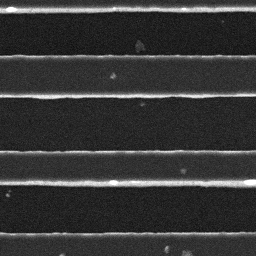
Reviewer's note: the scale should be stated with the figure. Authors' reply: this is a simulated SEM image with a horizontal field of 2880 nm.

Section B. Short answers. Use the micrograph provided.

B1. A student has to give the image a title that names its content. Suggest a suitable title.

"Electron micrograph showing lines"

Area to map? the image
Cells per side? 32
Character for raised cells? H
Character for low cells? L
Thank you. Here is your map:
HHHHHHHHHHHHHHHHHHHHHHHHHHHHHHHH
LLLLLLLLLLLLLLLLLLLLLLLLLLLLLLLL
LLLLLLLLLLLLLLLLLLLLLLLLLLLLLLLL
LLLLLLLLLLLLLLLLLLLLLLLLLLLLLLLL
LLLLLLLLLLLLLLLLLLLLLLLLLLLLLLLL
LLLLLLLLLLLLLLLLLLLLLLLLLLLLLLLL
LLLLLLLLLLLLLLLLLLLLLLLLLLLLLLLL
HHHHHHHHHHHHHHHHHHHHHHHHHHHHHHHH
HHHHHHHHHHHHHHHHHHHHHHHHHHHHHHHH
HHHHHHHHHHHHHHHHHHHHHHHHHHHHHHHH
HHHHHHHHHHHHHHHHHHHHHHHHHHHHHHHH
HHHHHHHHHHHHHHHHHHHHHHHHHHHHHHHH
LLLLLLLLLLLLLLLLLLLLLLLLLLLLLLLL
LLLLLLLLLLLLLLLLLLLLLLLLLLLLLLLL
LLLLLLLLLLLLLLLLLLLLLLLLLLLLLLLL
LLLLLLLLLLLLLLLLLLLLLLLLLLLLLLLL
LLLLLLLLLLLLLLLLLLLLLLLLLLLLLLLL
LLLLLLLLLLLLLLLLLLLLLLLLLLLLLLLL
LLLLLLLLLLLLLLLLLLLLLLLLLLLLLLLL
HHHHHHHHHHHHHHHHHHHHHHHHHHHHHHHH
HHHHHHHHHHHHHHHHHHHHHHHHHHHHHHHH
HHHHHHHHHHHHHHHHHHHHHHHHHHHHHHHH
HHHHHHHHHHHHHHHHHHHHHHHHHHHHHHHH
LLLLLLLLLLLLLLLLLLLLLLLLLLLLLLLL
LLLLLLLLLLLLLLLLLLLLLLLLLLLLLLLL
LLLLLLLLLLLLLLLLLLLLLLLLLLLLLLLL
LLLLLLLLLLLLLLLLLLLLLLLLLLLLLLLL
LLLLLLLLLLLLLLLLLLLLLLLLLLLLLLLL
LLLLLLLLLLLLLLLLLLLLLLLLLLLLLLLL
HHHHHHHHHHHHHHHHHHHHHHHHHHHHHHHH
HHHHHHHHHHHHHHHHHHHHHHHHHHHHHHHH
HHHHHHHHHHHHHHHHHHHHHHHHHHHHHHHH